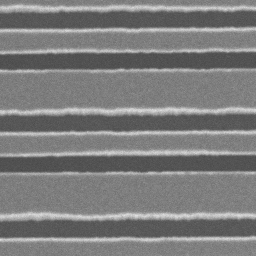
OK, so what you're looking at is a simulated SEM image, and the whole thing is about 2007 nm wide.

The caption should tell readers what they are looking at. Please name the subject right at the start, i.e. lines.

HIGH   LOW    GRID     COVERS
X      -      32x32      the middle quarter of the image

--------------------------------
-------------XX-XXXXXXXXXXXXXXXX
XXXXXXXXXXXXXXXXXXXXXXXXXXXXXXXX
XXXXXXXXXXXXXXXXXXXXXXXXXXXXXXXX
XXXXXXXXXXXXXXXXXXXXXXXXXXXXXXXX
XXXXXXXXXXXXXXXXXXXXXXXXXXXXXXXX
XXXXXXXXXXXXXXXXXXXXXXXXXXXXXXXX
XXXXXXXXXXXXXXXXXXXXXXXXXXXXXXXX
XXXXXXXXXXXXXXXXXXXXXXXXXXXXXXXX
XXXXXXXXXXXXXXXXXXXXXXXXXXXXXXXX
XXXXXXXXXXXXXXXXXXXXXXXXXXXXXXXX
XXXXXXXXXXXXXXXXXXXXXXXXXXXXXXXX
--------------------------------
--------------------------------
--------------------------------
--------------------------------
--------------------------------
XXXXXXXXXXXXXXXXXXXXXXXXXXXXXXXX
XXXXXXXXXXXXXXXXXXXXXXXXXXXXXXXX
XXXXXXXXXXXXXXXXXXXXXXXXXXXXXXXX
XXXXXXXXXXXXXXXXXXXXXXXXXXXXXXXX
XXXXXXXXXXXXXXXXXXXXXXXXXXXXXXXX
XXXXXXXXXXXXXXXXXXXXXXXXXXXXXXXX
--------------------------------
--------------------------------
--------------------------------
--------------------------------
XXXXXXXXXXXXXXXXXXXXXXXXXXXXXXXX
XXXXXXXXXXXXXXXXXXXXXXXXXXXXXXXX
XXXXXXXXXXXXXXXXXXXXXXXXXXXXXXXX
XXXXXXXXXXXXXXXXXXXXXXXXXXXXXXXX
XXXXXXXXXXXXXXXXXXXXXXXXXXXXXXXX